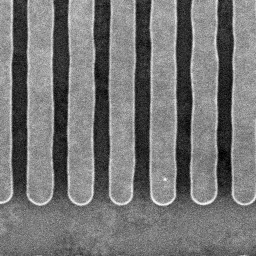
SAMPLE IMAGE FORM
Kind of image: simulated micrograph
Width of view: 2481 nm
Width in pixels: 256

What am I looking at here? groups of lines, slits or small figures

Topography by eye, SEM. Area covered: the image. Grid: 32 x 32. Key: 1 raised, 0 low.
10001110011100111001110011100111
10001110011100111001110011100111
10001110011100111001110011100111
10001110011100111001110011100111
10001110011100111001110011100111
10001110011100111001110011100111
10011110011100111001110011100111
10001110011100111001110011100111
10001100011100111001110011100111
10011110011100111001110011100111
10011110011100111001110011100111
10001110011100111001110011100111
10001110011100111001110011100111
10011110011100111001110011100111
10011110011100111001110011100111
10011110011100111001110011100111
10001110011100111001110011100111
10001110011100111001110011100111
10001110011100111001110011100111
10001100011100111001110011100111
10011110011100111001110011100111
10011110011100111001110011100111
10011110011100111001110011100111
10011110011100110001110011100111
10001100011100110001110011100111
00000000001000000000100000000010
00000000000000000000000000000000
00000000000000000000000000000000
00000000000000000000000000000000
00000000000000000000000000000000
00000000000000000000000000000000
00000000000000000000000000000000